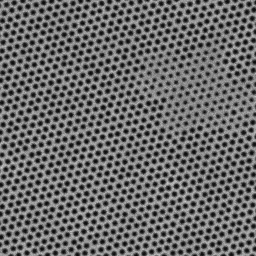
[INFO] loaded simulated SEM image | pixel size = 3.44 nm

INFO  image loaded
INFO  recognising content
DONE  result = a regular array of holes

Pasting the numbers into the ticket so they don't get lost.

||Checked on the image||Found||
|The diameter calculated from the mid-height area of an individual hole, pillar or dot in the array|18.6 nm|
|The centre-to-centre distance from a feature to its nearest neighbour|26.2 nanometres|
